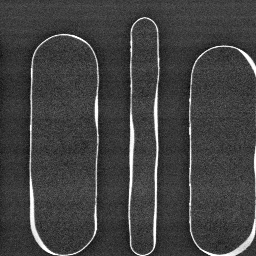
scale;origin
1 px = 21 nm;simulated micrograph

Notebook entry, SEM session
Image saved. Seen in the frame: groups of lines, slits or small figures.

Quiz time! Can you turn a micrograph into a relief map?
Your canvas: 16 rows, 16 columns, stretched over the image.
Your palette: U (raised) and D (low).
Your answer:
DDDDDDDDDDDDDDDD
DDDDDDDDUUDDDDDD
DDDUUDDDUUDDDDDD
DDUUUUDDUUDDDUUD
DDUUUUDDUUDDUUUU
DDUUUUDDUUDDUUUU
DDUUUUDDUUDDUUUU
DDUUUUDDUUDDUUUU
DDUUUUDDUUDDUUUU
DDUUUUDDUUDDUUUU
DDUUUUDDUUDDUUUU
DDUUUUDDUUDDUUUU
DDUUUUDDUUDDUUUU
DDUUUUDDUUDDUUUU
DDUUUUDDUUDDUUUU
DDDUUDDDUUDDDUUD